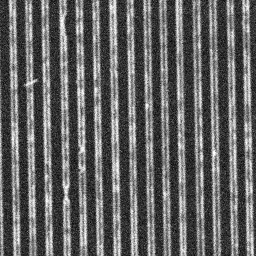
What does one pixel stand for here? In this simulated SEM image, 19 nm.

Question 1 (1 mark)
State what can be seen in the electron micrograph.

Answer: parallel lines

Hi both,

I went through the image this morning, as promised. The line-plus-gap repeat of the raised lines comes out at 0.317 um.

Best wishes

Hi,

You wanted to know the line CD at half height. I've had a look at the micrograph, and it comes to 0.0998 um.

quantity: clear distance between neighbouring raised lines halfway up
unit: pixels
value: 11.5